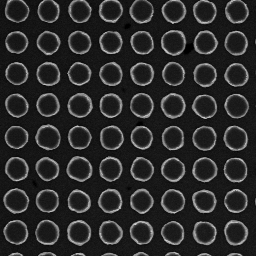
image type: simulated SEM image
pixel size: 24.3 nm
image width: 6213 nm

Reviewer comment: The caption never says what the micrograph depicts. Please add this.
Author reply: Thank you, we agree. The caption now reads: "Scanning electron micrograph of a regular array of raised bodies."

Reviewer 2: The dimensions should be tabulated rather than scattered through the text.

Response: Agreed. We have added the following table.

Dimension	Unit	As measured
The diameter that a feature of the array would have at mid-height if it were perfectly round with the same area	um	0.554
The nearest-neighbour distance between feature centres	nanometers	755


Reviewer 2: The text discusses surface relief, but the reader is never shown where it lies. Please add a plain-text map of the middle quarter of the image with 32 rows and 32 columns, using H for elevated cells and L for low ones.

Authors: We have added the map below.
LLHHHHLLLLHHHLLLLLHHHHLLLLHHHLLL
LHHHHHLLLHHHHHLLLHHHHHLLLHHHHHLL
LHHHHHLLLHHHHHLLLHHHHHLLLHHHHHLL
LLHHHHLLLHHHHHLLLHHHHHLLLHHHHHLL
LLHHHHLLLLHHHHLLLLHHHHLLLHHHHHLL
LLLLLLLLLLLLLLLLLLLLLLLLLLLLLLLL
LLLLLLLLLLLLLLLLLLLLLLLLLLLLLLLL
LLLLLLLLLLLLLLLLLLLHLLLLLLLHLLLL
LLHHHHLLLHHHHHLLLHHHHLLLLHHHHHLL
LHHHHHHLLHHHHHLLLHHHHHLLLHHHHHLL
LHHHHHHLLHHHHHLLLHHHHHLLHHHHHHLL
LHHHHHHLLHHHHHLLLHHHHHLLLHHHHHLL
LLHHHHLLLLHHHHLLLLHHHLLLLHHHHLLL
LLLLLLLLLLLLLLLLLLLLLLLLLLLLLLLL
LLLLLLLLLLLLLLLLLLLLLLLLLLLLLLLL
LLLHLLLLLLLLLLLLLLLLLLLLLLLLLLLL
LLHHHHLLLLHHHHLLLLHHHLLLLLHHHLLL
LHHHHHLLLHHHHHHLLHHHHHLLLHHHHHLL
LHHHHHHLLHHHHHHLLHHHHHLLLHHHHHLL
LLHHHHLLLHHHHHHLLHHHHHLLLHHHHHLL
LLHHHHLLLLHHHHLLLLHHHLLLLHHHHLLL
LLLLLLLLLLLLLLLLLLLLLLLLLLLLLLLL
LLLLLLLLLLLLLLLLLLLLLLLLLLLLLLLL
LLLHHLLLLLLHLLLLLLHHLLLLLLLLLLLL
LLHHHHLLLHHHHHLLLHHHHLLLLHHHHLLL
LHHHHHHLLHHHHHLLLHHHHHLLLHHHHHLL
LHHHHHHLLHHHHHLLLHHHHHLLHHHHHHLL
LHHHHHHLLHHHHHLLLHHHHHLLLHHHHHLL
LLHHHHLLLLHHHLLLLLHHHLLLLHHHHLLL
LLLLLLLLLLLLLLLLLLLLLLLLLLLLLLLL
LLLLLLLLLLLLLLLLLLLLLLLLLLLLLLLL
LLLLLLLLLLLLLLLLLLLLLLLLLLLLLLLL